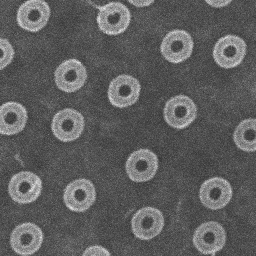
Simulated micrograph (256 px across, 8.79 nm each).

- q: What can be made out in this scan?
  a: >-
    a regular array of ring-shaped raised bodies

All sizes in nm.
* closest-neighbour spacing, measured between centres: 485